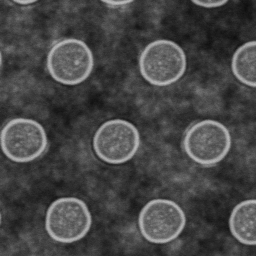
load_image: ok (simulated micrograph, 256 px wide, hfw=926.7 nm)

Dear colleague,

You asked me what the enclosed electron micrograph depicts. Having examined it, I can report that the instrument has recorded raised bodies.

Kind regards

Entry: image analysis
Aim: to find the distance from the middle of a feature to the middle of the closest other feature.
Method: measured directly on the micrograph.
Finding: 330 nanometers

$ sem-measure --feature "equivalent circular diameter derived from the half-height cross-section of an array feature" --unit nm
152